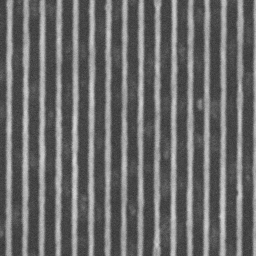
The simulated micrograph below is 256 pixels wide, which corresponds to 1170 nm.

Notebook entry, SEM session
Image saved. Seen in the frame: parallel lines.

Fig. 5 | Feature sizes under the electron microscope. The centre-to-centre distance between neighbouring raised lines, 16.5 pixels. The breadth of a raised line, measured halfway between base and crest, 17.7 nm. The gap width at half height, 56.6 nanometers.